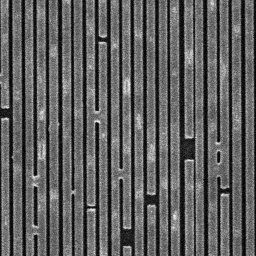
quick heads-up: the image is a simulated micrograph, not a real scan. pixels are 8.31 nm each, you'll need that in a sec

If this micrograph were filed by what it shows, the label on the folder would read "parallel lines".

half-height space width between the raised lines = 33.2 nm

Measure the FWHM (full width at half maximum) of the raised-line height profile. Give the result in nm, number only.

66.5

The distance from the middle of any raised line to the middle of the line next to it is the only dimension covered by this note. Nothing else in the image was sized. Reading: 102 nm